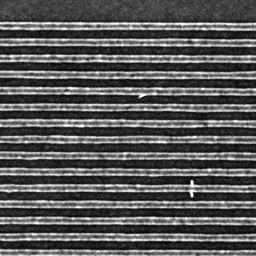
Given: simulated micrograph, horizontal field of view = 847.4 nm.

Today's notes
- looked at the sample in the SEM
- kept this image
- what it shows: parallel lines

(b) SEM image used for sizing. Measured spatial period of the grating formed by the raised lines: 53.7 nanometers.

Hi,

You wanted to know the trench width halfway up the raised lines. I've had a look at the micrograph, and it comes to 0.0356 micrometres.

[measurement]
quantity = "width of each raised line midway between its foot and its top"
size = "0.0182 um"